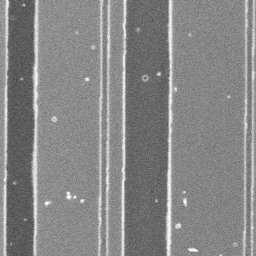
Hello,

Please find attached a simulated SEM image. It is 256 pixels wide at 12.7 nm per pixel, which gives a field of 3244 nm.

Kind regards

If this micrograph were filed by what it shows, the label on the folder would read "lines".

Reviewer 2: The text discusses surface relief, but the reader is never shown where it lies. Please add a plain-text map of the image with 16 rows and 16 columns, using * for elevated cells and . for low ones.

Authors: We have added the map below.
..******...*****
..******...*****
..******...*****
..******...*****
..******...*****
..******...*****
..******...*****
..******...*****
..******...*****
..******...*****
..******...*****
..******...*****
..******...*****
..******...*****
..******...*****
..******...*****